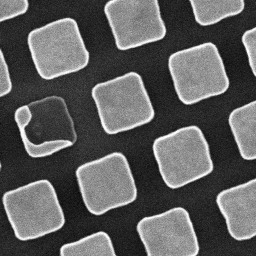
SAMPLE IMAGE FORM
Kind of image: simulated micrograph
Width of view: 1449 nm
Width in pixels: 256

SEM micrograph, raised bodies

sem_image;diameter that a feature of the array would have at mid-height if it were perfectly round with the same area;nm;328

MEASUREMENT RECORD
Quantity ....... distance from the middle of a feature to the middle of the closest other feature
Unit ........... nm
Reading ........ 453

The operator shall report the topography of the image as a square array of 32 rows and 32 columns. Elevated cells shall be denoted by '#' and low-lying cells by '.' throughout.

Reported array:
###..........#######....######..
###..........#######....######..
#......##.....######.....##.....
.....#####....#######...........
....######....######..........##
....######.....###.......#....##
....#######...........#####....#
#...#######..........#######...#
#....#####...........#######...#
#....##........##....#######....
#............#####....#######...
#...........######....######....
............#######....##.......
............#######...........##
..##.........######..........###
..#..........#####...........###
.............##.......###....###
...#................######....##
...#####...........#######....##
....##.......##....#######....##
...........#####....#######.....
..........######....######......
..........#######...####........
..#####...#######............###
.######...#######..........#####
#######....#####...........#####
.#######...##........##.....####
.#######..........######....####
..#####..........#######....####
..###......##.....######.....###
........######....#######.......
........######....#######.......